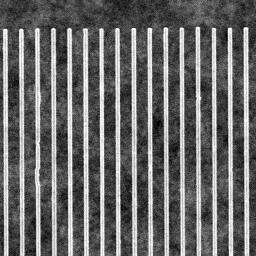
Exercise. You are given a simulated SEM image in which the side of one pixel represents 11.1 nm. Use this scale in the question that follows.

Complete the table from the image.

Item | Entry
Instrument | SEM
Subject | parallel lines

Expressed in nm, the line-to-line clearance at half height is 144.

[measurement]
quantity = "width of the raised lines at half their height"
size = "3.13 pixels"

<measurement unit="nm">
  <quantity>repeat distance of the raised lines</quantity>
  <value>177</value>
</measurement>